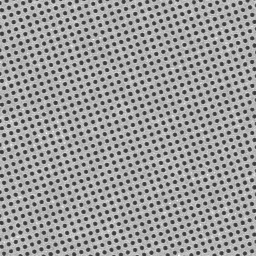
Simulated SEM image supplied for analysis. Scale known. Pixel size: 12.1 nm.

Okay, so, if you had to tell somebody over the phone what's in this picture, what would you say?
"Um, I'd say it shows a regular array of holes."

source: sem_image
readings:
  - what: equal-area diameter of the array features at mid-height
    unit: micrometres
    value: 0.0546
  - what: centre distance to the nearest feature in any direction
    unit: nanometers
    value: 87.5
